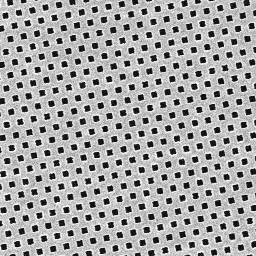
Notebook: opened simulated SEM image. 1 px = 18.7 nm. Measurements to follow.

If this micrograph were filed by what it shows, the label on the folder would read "a regular array of holes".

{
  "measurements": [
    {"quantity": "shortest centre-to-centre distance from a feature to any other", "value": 252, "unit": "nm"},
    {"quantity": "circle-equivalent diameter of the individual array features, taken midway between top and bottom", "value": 7.14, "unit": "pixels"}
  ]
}